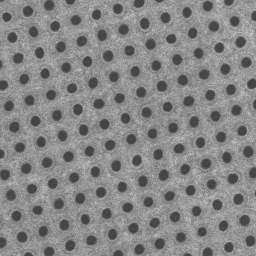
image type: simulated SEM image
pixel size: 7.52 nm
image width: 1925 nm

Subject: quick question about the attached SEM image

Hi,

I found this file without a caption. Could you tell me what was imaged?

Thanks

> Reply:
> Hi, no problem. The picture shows a regular array of holes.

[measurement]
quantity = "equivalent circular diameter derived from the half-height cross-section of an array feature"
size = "10 px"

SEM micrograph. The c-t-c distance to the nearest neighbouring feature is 161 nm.